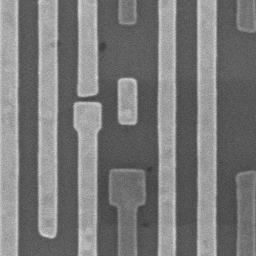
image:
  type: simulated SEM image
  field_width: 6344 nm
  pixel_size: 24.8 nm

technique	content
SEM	wiring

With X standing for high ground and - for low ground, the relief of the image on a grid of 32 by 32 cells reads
XX---XX---XX---XX---XX---XX---XX
XX---XX---XX---XX---XX---XX---XX
XX---XX---XX---XX---XX---XX---XX
XX---XX---XX--------XX---XX---XX
XX---XX---XX--------XX---XX-----
XX---XX---XX--------XX---XX-----
XX---XX---XX--------XX---XX-----
XX---XX---XX--------XX---XX-----
XX---XX---XX--------XX---XX-----
XX---XX---XX--------XX---XX-----
XX---XX---XX---XX---XX---XX-----
XX---XX---XX---XX---XX---XX-----
XX---XX--------XX---XX---XX-----
XX---XX--XXXX--XX---XX---XX-----
XX---XX--XXXX--XX---XX---XX-----
XX---XX--XXXX-------XX---XX-----
XX---XX---XX--------XX---XX-----
XX---XX---XX--------XX---XX-----
XX---XX---XX--------XX---XX-----
XX---XX---XX--------XX---XX-----
XX---XX---XX--------XX---XX-----
XX---XX---XX--XXXX--XX---XX----X
XX---XX---XX--XXXX--XX---XX---XX
XX---XX---XX--XXXX--XX---XX---XX
XX---XX---XX--XXXX--XX---XX---XX
XX---XX---XX--XXXX--XX---XX---XX
XX---XX---XX---XX---XX---XX---XX
XX---XX---XX---XX---XX---XX---XX
XX---XX---XX---XX---XX---XX---XX
XX----X---XX---XX---XX---XX---XX
XX--------XX---XX---XX---XX---XX
XX--------XX---XX---XX---XX---XX